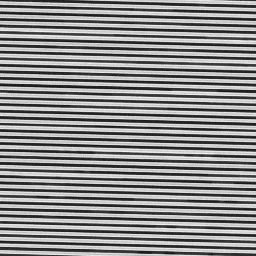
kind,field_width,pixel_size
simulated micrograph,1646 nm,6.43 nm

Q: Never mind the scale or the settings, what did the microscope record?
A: parallel lines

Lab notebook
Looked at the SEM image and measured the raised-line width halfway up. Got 18.5 nanometres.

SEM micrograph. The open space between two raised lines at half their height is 24.9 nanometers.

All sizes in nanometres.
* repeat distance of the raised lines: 42.1